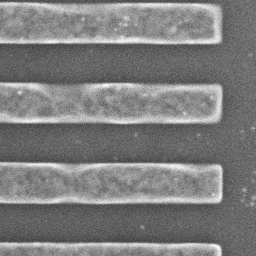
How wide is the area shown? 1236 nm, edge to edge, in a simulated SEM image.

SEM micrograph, wiring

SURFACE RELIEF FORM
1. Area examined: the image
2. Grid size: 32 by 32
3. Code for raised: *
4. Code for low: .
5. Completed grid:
*****...........*****...........
***************************.....
***************************.....
***************************.....
***************************.....
................................
................................
................................
................................
................................
*.............**................
*******...******************....
****************************....
***************************.....
***************************.....
................................
................................
................................
................................
................................
*******......*******............
****************************....
****************************....
****************************....
****************************....
................................
................................
................................
................................
................................
*******...*********....***......
****************************....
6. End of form